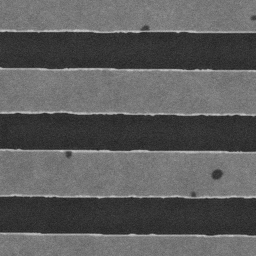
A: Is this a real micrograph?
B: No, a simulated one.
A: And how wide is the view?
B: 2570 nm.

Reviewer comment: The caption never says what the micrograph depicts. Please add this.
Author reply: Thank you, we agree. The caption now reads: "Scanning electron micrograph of lines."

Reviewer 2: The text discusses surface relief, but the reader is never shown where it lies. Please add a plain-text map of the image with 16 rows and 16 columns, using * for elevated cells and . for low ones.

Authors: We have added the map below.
****************
****************
................
................
****************
****************
****************
................
................
****************
****************
****************
................
................
................
****************